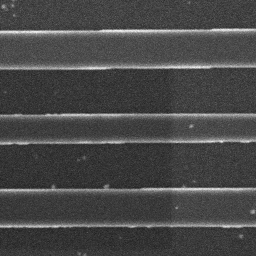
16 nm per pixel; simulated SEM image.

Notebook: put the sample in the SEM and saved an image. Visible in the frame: lines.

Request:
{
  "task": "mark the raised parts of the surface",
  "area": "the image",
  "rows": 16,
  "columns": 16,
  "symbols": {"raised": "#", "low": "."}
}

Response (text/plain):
................
................
################
################
................
................
................
################
################
................
................
................
################
################
................
................